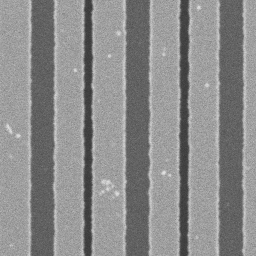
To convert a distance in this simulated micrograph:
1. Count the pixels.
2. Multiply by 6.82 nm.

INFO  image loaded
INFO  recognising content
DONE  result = lines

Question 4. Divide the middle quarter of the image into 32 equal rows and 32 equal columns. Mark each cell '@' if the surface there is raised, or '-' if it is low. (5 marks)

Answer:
@@@@@--@@@@@@@@------@@@@@@@@--@
@@@@@--@@@@@@@@-------@@@@@@@--@
@@@@@--@@@@@@@@------@@@@@@@@--@
@@@@@--@@@@@@@@------@@@@@@@@--@
@@@@@--@@@@@@@@------@@@@@@@@--@
@@@@@--@@@@@@@@-------@@@@@@@--@
@@@@@--@@@@@@@@------@@@@@@@@--@
@@@@@--@@@@@@@@-------@@@@@@@--@
@@@@@--@@@@@@@@------@@@@@@@@--@
@@@@@--@@@@@@@@------@@@@@@@@--@
@@@@@--@@@@@@@@------@@@@@@@@--@
@@@@@--@@@@@@@@-------@@@@@@@--@
@@@@@--@@@@@@@@-------@@@@@@@--@
@@@@@--@@@@@@@@-------@@@@@@@--@
@@@@@--@@@@@@@@-------@@@@@@@--@
@@@@@--@@@@@@@@------@@@@@@@@--@
@@@@@--@@@@@@@@------@@@@@@@@--@
@@@@@--@@@@@@@@-------@@@@@@@--@
@@@@@--@@@@@@@@------@@@@@@@@--@
@@@@@--@@@@@@@@------@@@@@@@@--@
@@@@@--@@@@@@@@-------@@@@@@@--@
@@@@@--@@@@@@@@------@@@@@@@@--@
@@@@@--@@@@@@@@------@@@@@@@@--@
@@@@@--@@@@@@@@------@@@@@@@@--@
@@@@@--@@@@@@@@-------@@@@@@@--@
@@@@@--@@@@@@@@-------@@@@@@@--@
@@@@@--@@@@@@@@------@@@@@@@@--@
@@@@@--@@@@@@@@------@@@@@@@@--@
@@@@@--@@@@@@@@------@@@@@@@@--@
@@@@@--@@@@@@@@-------@@@@@@@--@
@@@@@--@@@@@@@@-------@@@@@@@--@
@@@@@--@@@@@@@@------@@@@@@@@--@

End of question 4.